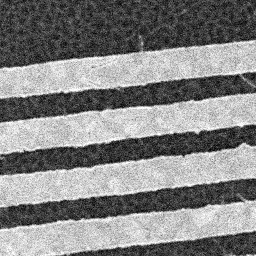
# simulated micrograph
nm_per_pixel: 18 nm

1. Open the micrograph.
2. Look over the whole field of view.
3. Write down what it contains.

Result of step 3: parallel lines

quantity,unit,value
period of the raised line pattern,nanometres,961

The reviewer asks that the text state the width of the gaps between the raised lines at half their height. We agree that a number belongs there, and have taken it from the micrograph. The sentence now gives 420 nm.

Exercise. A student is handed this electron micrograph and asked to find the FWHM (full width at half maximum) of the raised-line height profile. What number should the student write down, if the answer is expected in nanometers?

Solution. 536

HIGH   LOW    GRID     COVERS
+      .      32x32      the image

................................
................................
................................
................................
................................
.............................+++
...................+++++++++++++
........++++++++++++++++++++++++
.+++++++++++++++++++++++++++++++
++++++++++++++++++++++++++......
++++++++++++++++++..............
+++++++.........................
..........................++++++
.................+++++++++++++++
.........+++++++++++++++++++++++
+++++++++++++++++++++++++++++++.
+++++++++++++++++++++++.+.......
++++++++++++++..................
++++++.......................+++
.......................+++++++++
..............++++++++++++++++++
......++++++++++++++++++++++++++
+++++++++++++++++++++++++++++...
++++++++++++++++++++............
+++++++++++++...................
+++..........................+++
.....................+++++++++++
..........++++++++++++++++++++++
..++++++++++++++++++++++++++++++
+++++++++++++++++++++++++++.....
++++++++++++++++++..............
++++++++++......................